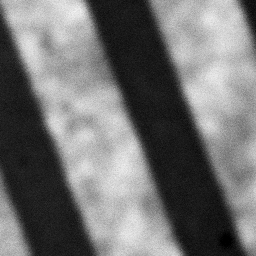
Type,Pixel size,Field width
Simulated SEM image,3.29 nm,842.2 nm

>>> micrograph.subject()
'one or a few lines or trenches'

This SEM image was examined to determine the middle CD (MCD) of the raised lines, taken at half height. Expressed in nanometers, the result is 253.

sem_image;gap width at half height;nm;208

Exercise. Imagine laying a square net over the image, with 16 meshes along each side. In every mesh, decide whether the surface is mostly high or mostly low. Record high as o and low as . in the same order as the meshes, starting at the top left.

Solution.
ooooo.....ooooo.
.ooooo....ooooo.
.ooooo....oooooo
.oooooo....ooooo
..ooooo....ooooo
..ooooo.....oooo
...ooooo....oooo
...ooooo....oooo
...ooooo.....ooo
....ooooo....ooo
....ooooo....ooo
....oooooo....oo
o....ooooo....oo
o....ooooo.....o
o.....ooooo....o
oo....ooooo....o